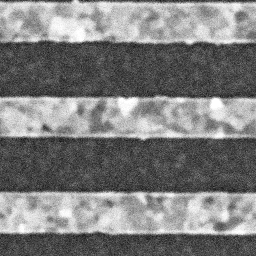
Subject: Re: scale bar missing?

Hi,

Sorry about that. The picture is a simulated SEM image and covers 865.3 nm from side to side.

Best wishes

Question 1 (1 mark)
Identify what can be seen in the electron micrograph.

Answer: one or a few lines or trenches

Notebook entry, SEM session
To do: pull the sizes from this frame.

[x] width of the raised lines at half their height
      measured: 0.129 micrometres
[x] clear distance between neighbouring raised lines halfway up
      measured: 193 nanometers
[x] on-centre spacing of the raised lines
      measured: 322 nanometres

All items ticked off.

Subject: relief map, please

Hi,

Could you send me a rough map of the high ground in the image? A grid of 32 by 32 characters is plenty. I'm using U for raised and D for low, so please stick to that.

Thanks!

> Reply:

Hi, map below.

UUUUUUDDDUUUUUUUUUUUDDDUUUUUDUUU
UUUUUUUUUUUUUUUUUUUUUUUUUUUUUUUU
UUUUUUUUUUUUUUUUUUUUUUUUUUUUUUUU
UUUUUUUUUUUUUUUUUUUUUUUUUUUUUUUU
UUUUUUUUUUUUUUUUUUUUUUUUUUUUUUUU
DDDDDDDDDDDDDDDDDDDDDDDDDDDDDDDD
DDDDDDDDDDDDDDDDDDDDDDDDDDDDDDDD
DDDDDDDDDDDDDDDDDDDDDDDDDDDDDDDD
DDDDDDDDDDDDDDDDDDDDDDDDDDDDDDDD
DDDDDDDDDDDDDDDDDDDDDDDDDDDDDDDD
DDDDDDDDDDDDDDDDDDDDDDDDDDDDDDDD
DDDDDDDDDDDDDDDDDDDDDDDDDDDDDDDD
UUUUUUUUUUUUUUUUUUUUUUUUUUUUUUUU
UUUUUUUUUUUUUUUUUUUUUUUUUUUUUUUU
UUUUUUUUUUUUUUUUUUUUUUUUUUUUUUUU
UUUUUUUUUUUUUUUUUUUUUUUUUUUUUUUU
UUUUUUUUUUUUUUUUUUUUUUUUUUUUUUUU
DDDDDDDDDDDDDDDDDDDDDDDDDDDDDDDD
DDDDDDDDDDDDDDDDDDDDDDDDDDDDDDDD
DDDDDDDDDDDDDDDDDDDDDDDDDDDDDDDD
DDDDDDDDDDDDDDDDDDDDDDDDDDDDDDDD
DDDDDDDDDDDDDDDDDDDDDDDDDDDDDDDD
DDDDDDDDDDDDDDDDDDDDDDDDDDDDDDDD
DDDDDDDDDDDDDDDDDDDDDDDDDDDDDDDD
UUUUUUUUUUUUUUUUUUUUUUUUUUUUUUUU
UUUUUUUUUUUUUUUUUUUUUUUUUUUUUUUU
UUUUUUUUUUUUUUUUUUUUUUUUUUUUUUUU
UUUUUUUUUUUUUUUUUUUUUUUUUUUUUUUU
UUUUUUUUUUUUUUUUUUUUUUUUUUUUUUUU
DDDDDDDDDDDDDDDDDDDDDDDDDDDDDDDD
DDDDDDDDDDDDDDDDDDDDDDDDDDDDDDDD
DDDDDDDDDDDDDDDDDDDDDDDDDDDDDDDD